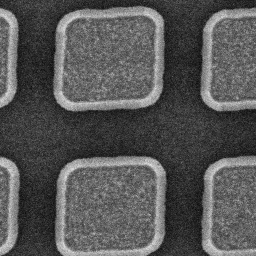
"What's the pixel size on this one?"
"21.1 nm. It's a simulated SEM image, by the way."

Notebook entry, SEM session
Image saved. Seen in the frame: raised bodies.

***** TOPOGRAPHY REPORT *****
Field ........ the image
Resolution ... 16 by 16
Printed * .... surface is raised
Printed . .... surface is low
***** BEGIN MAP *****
................
*...******...***
*...******...***
*...******...***
*...******...***
*...******...***
....*****....***
................
................
................
*...******...***
*...******...***
*...******...***
*...******...***
*...******...***
....*****....***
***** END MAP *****